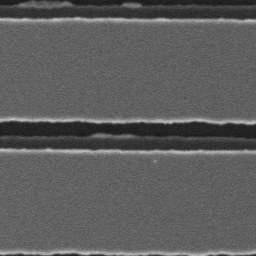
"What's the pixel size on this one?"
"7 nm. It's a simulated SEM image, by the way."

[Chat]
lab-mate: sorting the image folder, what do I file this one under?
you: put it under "lines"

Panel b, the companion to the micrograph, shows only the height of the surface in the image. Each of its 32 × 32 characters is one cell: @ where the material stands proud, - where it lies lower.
--------------------------------
--------------------------------
@@@@@@@@@@@@@@@@@@@@@@@@@@@@@@@@
@@@@@@@@@@@@@@@@@@@@@@@@@@@@@@@@
@@@@@@@@@@@@@@@@@@@@@@@@@@@@@@@@
@@@@@@@@@@@@@@@@@@@@@@@@@@@@@@@@
@@@@@@@@@@@@@@@@@@@@@@@@@@@@@@@@
@@@@@@@@@@@@@@@@@@@@@@@@@@@@@@@@
@@@@@@@@@@@@@@@@@@@@@@@@@@@@@@@@
@@@@@@@@@@@@@@@@@@@@@@@@@@@@@@@@
@@@@@@@@@@@@@@@@@@@@@@@@@@@@@@@@
@@@@@@@@@@@@@@@@@@@@@@@@@@@@@@@@
@@@@@@@@@@@@@@@@@@@@@@@@@@@@@@@@
@@@@@@@@@@@@@@@@@@@@@@@@@@@@@@@@
@@@@@@@@@@@@@@@@@@@@@@@@@@@@@@@@
--------------------------------
--------------------------------
--------------------------------
--------------------------------
@@@@@@@@@@@@@@@@@@@@@@@@@@@@@@@@
@@@@@@@@@@@@@@@@@@@@@@@@@@@@@@@@
@@@@@@@@@@@@@@@@@@@@@@@@@@@@@@@@
@@@@@@@@@@@@@@@@@@@@@@@@@@@@@@@@
@@@@@@@@@@@@@@@@@@@@@@@@@@@@@@@@
@@@@@@@@@@@@@@@@@@@@@@@@@@@@@@@@
@@@@@@@@@@@@@@@@@@@@@@@@@@@@@@@@
@@@@@@@@@@@@@@@@@@@@@@@@@@@@@@@@
@@@@@@@@@@@@@@@@@@@@@@@@@@@@@@@@
@@@@@@@@@@@@@@@@@@@@@@@@@@@@@@@@
@@@@@@@@@@@@@@@@@@@@@@@@@@@@@@@@
@@@@@@@@@@@@@@@@@@@@@@@@@@@@@@@@
@@@@@@@@@@@@@@@@@@@@@@@@@@@@@@@@